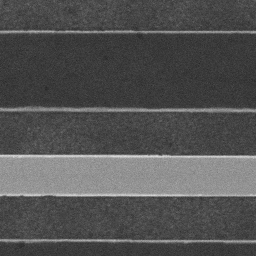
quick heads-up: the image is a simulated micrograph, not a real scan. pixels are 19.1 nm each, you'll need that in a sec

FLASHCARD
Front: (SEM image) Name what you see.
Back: lines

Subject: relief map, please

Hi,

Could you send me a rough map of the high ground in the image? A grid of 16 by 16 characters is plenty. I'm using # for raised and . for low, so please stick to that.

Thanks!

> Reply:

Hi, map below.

................
................
################
################
################
################
################
................
................
................
################
################
................
................
................
################